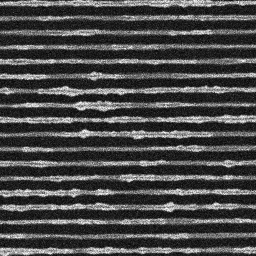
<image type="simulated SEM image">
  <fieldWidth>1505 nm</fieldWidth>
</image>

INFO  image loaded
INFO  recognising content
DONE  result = parallel lines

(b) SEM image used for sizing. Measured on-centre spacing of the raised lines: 85.6 nanometers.